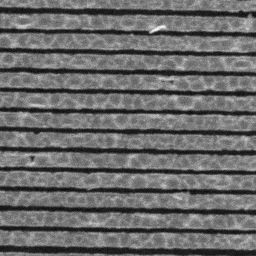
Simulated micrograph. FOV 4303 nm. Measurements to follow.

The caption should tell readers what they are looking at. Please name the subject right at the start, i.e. parallel lines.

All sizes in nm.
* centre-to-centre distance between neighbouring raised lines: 332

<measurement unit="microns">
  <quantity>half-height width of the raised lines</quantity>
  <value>0.237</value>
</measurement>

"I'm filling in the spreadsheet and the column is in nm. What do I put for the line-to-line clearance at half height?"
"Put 103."